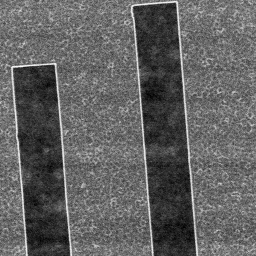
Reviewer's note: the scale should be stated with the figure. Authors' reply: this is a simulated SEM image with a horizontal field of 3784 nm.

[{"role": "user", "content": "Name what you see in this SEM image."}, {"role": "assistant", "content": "one or a few lines or trenches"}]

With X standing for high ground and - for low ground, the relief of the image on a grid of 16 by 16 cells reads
XXXXXXXX---XXXXX
XXXXXXXX---XXXXX
XXXXXXXX---XXXXX
XXXXXXXXX--XXXXX
X---XXXXX--XXXXX
X---XXXXX---XXXX
X---XXXXX---XXXX
X---XXXXX---XXXX
X---XXXXX---XXXX
X---XXXXX---XXXX
X---XXXXX---XXXX
X---XXXXX---XXXX
X---XXXXX---XXXX
X---XXXXX---XXXX
XX--XXXXX---XXXX
XX--XXXXXX--XXXX